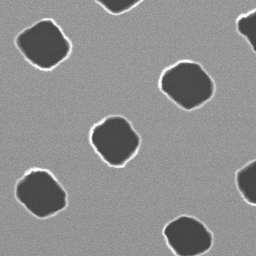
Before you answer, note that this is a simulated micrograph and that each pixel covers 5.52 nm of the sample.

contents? holes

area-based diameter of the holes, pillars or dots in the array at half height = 0.248 micrometres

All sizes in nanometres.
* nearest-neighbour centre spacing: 503